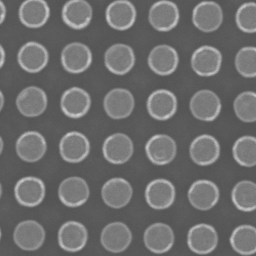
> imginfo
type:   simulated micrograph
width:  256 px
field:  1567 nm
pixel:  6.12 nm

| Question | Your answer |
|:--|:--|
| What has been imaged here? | a regular array of raised bodies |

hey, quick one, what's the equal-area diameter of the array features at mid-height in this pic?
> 185 nm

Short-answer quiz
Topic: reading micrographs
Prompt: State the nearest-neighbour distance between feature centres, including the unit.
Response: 0.265 um